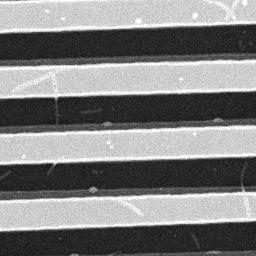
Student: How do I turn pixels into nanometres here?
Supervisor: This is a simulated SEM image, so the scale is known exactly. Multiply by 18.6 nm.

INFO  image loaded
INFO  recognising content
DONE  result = lines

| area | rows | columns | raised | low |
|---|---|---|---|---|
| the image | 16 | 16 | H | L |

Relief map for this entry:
HHHHHHHHHHHHHHHH
HHHHHHHHHHHHHHHL
LLLLLLLLLLLLLLLL
LLLLLLLLLLLLLLLL
HHHHHHHHHHHHHHHH
HHHHHHHHHHHHHHHH
LLLLLLLLLLLLLLLL
LLLLLLLLLLLLLLLL
HHHHHHHHHHHHHHHH
HHHHHHHHHHHHHHHH
LLLLLLLLLLLLLLLL
LLLLLLLLLLLLLLLL
LHHHHHHHHHHHHHHH
HHHHHHHHHHHHHHHH
LLLLLLLLLLLLLLLL
LLLLLLLLLLLLLLLL